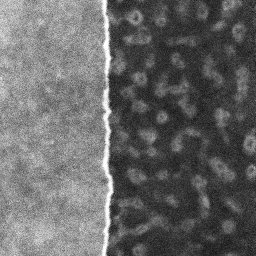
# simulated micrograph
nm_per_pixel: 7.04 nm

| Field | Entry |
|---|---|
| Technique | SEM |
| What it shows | one or a few lines or trenches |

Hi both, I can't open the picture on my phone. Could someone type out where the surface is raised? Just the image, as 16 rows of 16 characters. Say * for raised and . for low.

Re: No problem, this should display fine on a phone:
*******.........
*******.........
*******.........
*******.........
*******.........
*******.........
*******.........
*******.........
*******.........
*******.........
*******.........
*******.........
*******.........
*******.........
*******.........
*******.........